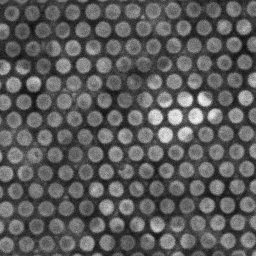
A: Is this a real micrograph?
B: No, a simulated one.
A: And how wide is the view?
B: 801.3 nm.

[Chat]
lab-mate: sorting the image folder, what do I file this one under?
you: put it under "a regular array of raised bodies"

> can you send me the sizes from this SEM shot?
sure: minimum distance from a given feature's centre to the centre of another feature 0.0621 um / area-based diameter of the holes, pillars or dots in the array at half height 46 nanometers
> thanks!